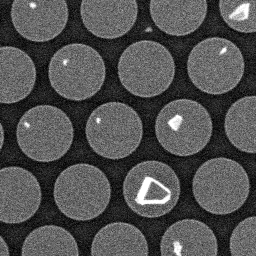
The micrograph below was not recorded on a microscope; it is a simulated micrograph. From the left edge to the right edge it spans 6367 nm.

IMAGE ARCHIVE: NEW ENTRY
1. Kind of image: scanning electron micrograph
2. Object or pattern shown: an array of small figures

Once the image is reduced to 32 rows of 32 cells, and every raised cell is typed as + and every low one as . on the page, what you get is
..++++++..+++++++..+++++++.+++++
..++++++..+++++++..+++++++..++++
..++++++..+++++++..++++++...++++
..++++++...+++++....+++++....+++
...++++.....+++.................
.................+++.....++++...
+++....+++++....+++++...++++++..
++++..+++++++..+++++++..++++++..
++++..+++++++..+++++++..++++++..
++++..+++++++..+++++++..++++++..
++++..+++++++..++++++...++++++..
++++...+++++....++++......++....
++............................++
....+++.....++++....+++++....+++
...+++++...++++++...++++++..++++
..+++++++..+++++++..++++++..++++
..+++++++..+++++++..++++++..++++
..+++++++..+++++++..++++++...+++
...++++++...+++++....++++.....++
....++++.....+++................
.................+++......++++..
++++....+++++...++++++...++++++.
+++++..++++++...++++++..+++++++.
+++++..+++++++.+++++++..+++++++.
+++++..+++++++..++++++..+++++++.
+++++..++++++...++++++...+++++..
++++....+++++....++++.....+++...
+++............................+
.....++......++++....+++++...+++
....+++++...++++++..+++++++..+++
+..++++++...++++++..+++++++..+++
+..+++++++..++++++..+++++++..+++